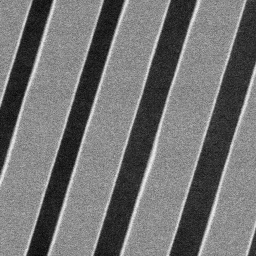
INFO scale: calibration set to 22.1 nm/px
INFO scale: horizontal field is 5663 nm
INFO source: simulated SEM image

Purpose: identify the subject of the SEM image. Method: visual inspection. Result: lines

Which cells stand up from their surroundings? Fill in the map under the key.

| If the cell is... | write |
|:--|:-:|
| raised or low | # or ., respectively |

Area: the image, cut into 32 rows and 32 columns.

####...######..######....######.
####..#######..######...######..
###...######...#####....######..
###...######...#####....######..
###..#######..######...######...
##...######...######...######...
##...######...#####....######...
##..#######..######...#######...
#...######...######...######....
#...######...#####....######...#
#..#######..######...#######...#
#..######...######...######....#
...######...#####....######....#
...######...#####...#######...##
..#######..######...######....##
..######...######...######....##
..######...#####....######...###
.#######..######...######....###
.######...######...######....###
.######...#####....######...####
.######..######...#######...####
######...######...######....####
######...######...######....####
######..######....######...#####
######..######...######....#####
#####...######...######....#####
#####...#####....######...######
#####..######...######....######
####...######...######....######
####...#####....######...#######
####..######...#######...######.
###...######...######....######.